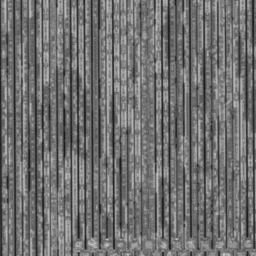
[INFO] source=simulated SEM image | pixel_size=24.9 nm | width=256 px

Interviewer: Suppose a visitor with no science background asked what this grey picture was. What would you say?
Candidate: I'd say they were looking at parallel lines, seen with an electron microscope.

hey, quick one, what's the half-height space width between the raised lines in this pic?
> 0.0499 um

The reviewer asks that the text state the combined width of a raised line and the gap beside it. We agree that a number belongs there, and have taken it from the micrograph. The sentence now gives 176 nm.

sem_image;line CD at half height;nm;122